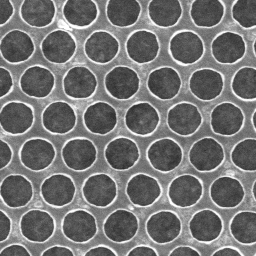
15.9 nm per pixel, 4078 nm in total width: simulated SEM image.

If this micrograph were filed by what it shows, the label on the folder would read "a regular array of holes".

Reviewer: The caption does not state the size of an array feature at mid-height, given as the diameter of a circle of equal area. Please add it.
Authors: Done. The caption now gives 526 nm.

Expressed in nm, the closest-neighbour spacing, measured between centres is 652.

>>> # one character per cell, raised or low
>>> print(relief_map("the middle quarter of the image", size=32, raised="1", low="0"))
11110111111111111111111111111111
10000011111100000111111000001111
10000001111000000011110000001111
00000000110000000001100000000111
00000000110000000001100000000110
00000000110000000001100000000110
00000000111000000011100000000111
00000001111000000011110000001111
11000011111110001111111100011111
11111111001111111111111111111111
00111110000011111000001111110000
00111000000001110000000111000000
00011000000001100000000011000000
00011000000001100000000011000000
00011000000001100000000011000000
00011000000001110000000111000000
00111100000011110000000111100000
11111111101111111100011111111000
11111111111110001111111111111111
10000001111100000111111000001111
00000000111000000011110000000111
00000000110000000001100000000111
00000000110000000001100000000010
00000000110000000011100000000010
00000000111000000011110000000111
10000011111100000111110000001111
11101111111110011111111100011111
11111111001111111100111111111111
00111100000011111000001111110000
00111000000001110000000111100000
00011000000001110000000011000000
00011000000001110000000011000000